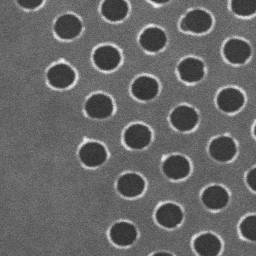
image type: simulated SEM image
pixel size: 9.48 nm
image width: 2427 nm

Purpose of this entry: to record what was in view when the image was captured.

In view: a regular array of holes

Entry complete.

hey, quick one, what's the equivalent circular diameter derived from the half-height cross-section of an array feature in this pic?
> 251 nm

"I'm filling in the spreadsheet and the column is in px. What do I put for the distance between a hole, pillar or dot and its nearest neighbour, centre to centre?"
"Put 48.8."